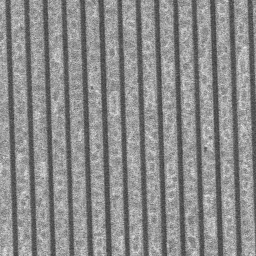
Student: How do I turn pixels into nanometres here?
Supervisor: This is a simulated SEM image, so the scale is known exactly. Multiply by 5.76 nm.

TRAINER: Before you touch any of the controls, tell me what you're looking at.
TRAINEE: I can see parallel lines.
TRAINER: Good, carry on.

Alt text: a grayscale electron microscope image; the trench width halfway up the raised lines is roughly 0.0309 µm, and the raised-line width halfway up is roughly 77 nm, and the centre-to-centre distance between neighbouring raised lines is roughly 18.6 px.